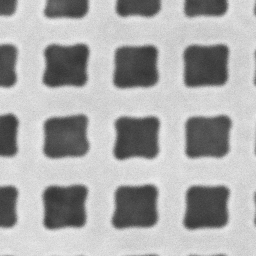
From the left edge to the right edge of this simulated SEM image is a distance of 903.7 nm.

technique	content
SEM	a regular array of holes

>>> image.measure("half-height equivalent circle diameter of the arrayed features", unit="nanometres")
174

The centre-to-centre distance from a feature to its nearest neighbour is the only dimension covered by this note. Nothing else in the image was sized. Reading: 69.9 pixels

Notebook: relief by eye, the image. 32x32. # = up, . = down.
..####.....###......###......###
..###......###......###.....####
################################
################################
################################
..####.##..################.####
..###......###......###......###
..####.....###......###......###
..####.....###......###......###
..###......###......###......###
..###......###......###.....####
################################
################################
################################
..######...####.##.#####.....###
..###......###......###......###
..###......###......###......###
..###......###......###......###
..###......###......###......###
..####.....###......###.....####
################################
################################
################################
..####.....####.....####.....###
..###......###......###......###
..###......###......###......###
..###......###......###......###
..###......###......###......###
.#####....####.....####.....####
################################
################################
################################